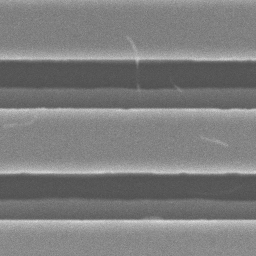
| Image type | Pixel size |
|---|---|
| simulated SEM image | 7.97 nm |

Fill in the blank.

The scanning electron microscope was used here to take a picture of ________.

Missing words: lines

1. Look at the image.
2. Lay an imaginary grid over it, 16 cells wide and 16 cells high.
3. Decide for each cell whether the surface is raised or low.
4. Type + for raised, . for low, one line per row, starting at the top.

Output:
++++++++++++++++
++++++++++++++++
++++++++++++++++
++++++++++++++++
................
................
++++++++++++++++
++++++++++++++++
++++++++++++++++
++++++++++++++++
++++++++++++++++
................
................
++++++++++++++++
++++++++++++++++
++++++++++++++++